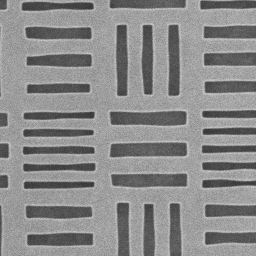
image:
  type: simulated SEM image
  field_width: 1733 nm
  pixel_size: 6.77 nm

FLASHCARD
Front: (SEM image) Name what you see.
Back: groups of lines, slits or small figures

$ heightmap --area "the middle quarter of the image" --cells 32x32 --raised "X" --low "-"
-------XXXXXX---XXX---XXXX---XXX
XXXXXXXXXXXXX---XXX---XXXX---XXX
XXXXXXXXXXXXX---XXX---XXXX---XXX
XXXXXXXXXXXXX---XXX---XXXX---XXX
XXXXXXXXXXXXX---XXXX--XXXX---XXX
-------XXXXXX---XXXX--XXXX---XXX
-------XXXXXX---XXXX--XXXX---XXX
XXXXXXXXXXXXX---XXXX--XXXX---XXX
XXXXXXXXXXXXXXXXXXXXXXXXXXXXXXXX
XXXXXXXXXXXXXXXXXXXXXXXXXXXXXXXX
XXXXXXXXXXXXXXXXXXXXXXXXXXXXXXXX
XXXXXXXXXXXXXXXXXXXXXXXXXXXXXXXX
--------XXX--------------------X
--------XXX--------------------X
XXXXXXXXXXX--------------------X
XXXXXXXXXXXXXXXXXXXXXXXX---XXXXX
-------XXXXXXXXXXXXXXXXXXXXXXXXX
-------XXXXXXXXXXXXXXXXXXXXXXXXX
XXXXXXXXXXXXXXXXXXXXXXXXXXXXXXXX
XXXXXXXXXXXXXXXXXXXXXXXXXXXXXXXX
-----XXXXXXX-------------------X
--------XXX--------------------X
-------XXXX--------------------X
XXXXXXXXXXXXXXXXXXXXXXXXXXXXXXXX
XXXXXXXXXXXXXXXXXXXXXXXXXXXXXXXX
--------XXXXXXXXXXXXXXXXXXXXXXXX
--------XXXXXXXXXXXXXXXXXXXXXXXX
XXXXXXXXXXXX-XXXX-------------XX
XXXXXXXXXXXX-------------------X
-------XXXXX-------------------X
-------XXXXX-------------------X
XXXXXXXXXXXXXXXXXXXXXXXXXXXXXXXX